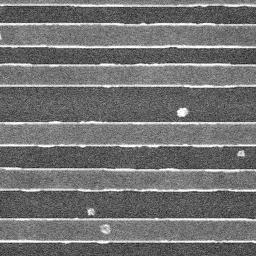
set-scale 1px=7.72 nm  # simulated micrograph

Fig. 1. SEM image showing lines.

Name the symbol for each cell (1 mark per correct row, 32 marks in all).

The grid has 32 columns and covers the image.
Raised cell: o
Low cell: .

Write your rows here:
oooooooooooooooooooooooooooooooo
................................
................................
oooooooooooooooooooooooooooooooo
oooooooooooooooooooooooooooooooo
oooooooooooooooooooooooooooooooo
................................
................................
oooooooooooooooooooooooooooooooo
oooooooooooooooooooooooooooooooo
oooooooooooooooooooooooooooooooo
................................
................................
................................
................................
oooooooooooooooooooooooooooooooo
oooooooooooooooooooooooooooooooo
oooooooooooooooooooooooooooooooo
................................
................................
................................
oooooooooooooooooooooooooooooooo
oooooooooooooooooooooooooooooooo
oooooooooooooooooooooooooooooooo
................................
................................
................................
oooooooooooooooooooooooooooooooo
oooooooooooooooooooooooooooooooo
oooooooooooooooooooooooooooooooo
................................
................................